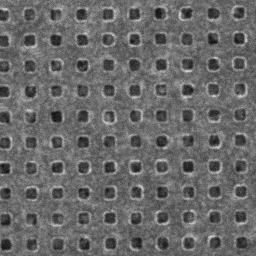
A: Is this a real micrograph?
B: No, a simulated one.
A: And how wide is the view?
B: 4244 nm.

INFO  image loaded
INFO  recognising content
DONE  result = a regular array of raised bodies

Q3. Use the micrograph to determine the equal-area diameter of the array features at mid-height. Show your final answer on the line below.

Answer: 237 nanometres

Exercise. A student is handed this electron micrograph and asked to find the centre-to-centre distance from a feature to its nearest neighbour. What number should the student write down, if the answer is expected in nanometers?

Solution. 420